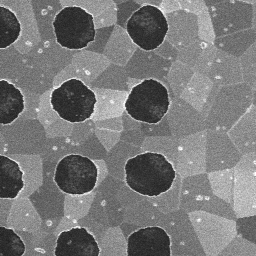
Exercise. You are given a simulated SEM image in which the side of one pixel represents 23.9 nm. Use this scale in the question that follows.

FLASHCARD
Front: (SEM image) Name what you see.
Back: holes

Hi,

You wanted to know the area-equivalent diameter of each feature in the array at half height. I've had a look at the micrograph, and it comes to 1.03 micrometres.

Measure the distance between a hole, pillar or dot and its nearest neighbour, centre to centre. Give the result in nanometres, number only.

1740